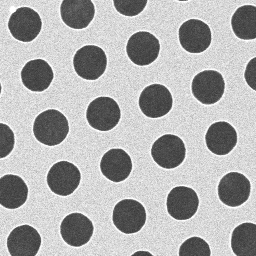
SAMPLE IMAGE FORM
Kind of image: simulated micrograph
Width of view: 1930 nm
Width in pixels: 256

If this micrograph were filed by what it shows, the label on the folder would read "a regular array of holes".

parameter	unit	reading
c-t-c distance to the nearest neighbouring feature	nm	397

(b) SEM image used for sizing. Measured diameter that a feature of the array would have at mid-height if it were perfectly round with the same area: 254 nanometers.